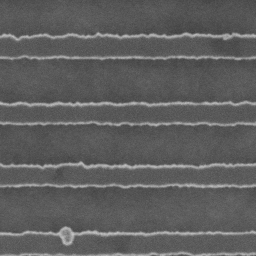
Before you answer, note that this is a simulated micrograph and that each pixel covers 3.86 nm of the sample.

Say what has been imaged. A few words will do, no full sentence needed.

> lines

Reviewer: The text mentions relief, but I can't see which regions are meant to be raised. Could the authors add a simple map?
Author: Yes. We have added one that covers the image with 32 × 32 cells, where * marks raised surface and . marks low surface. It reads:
................................
................................
................................
................................
**..**..**.****.****************
********************************
********************************
................................
................................
................................
................................
................................
................................
********************************
********************************
*******.**..***.******.*********
................................
................................
................................
................................
........***...............**...*
********************************
********************************
................................
................................
................................
................................
................................
................................
********************************
********************************
********************************